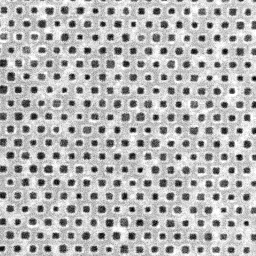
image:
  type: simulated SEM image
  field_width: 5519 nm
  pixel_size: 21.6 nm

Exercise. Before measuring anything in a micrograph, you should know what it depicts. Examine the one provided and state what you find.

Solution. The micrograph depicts a regular array of holes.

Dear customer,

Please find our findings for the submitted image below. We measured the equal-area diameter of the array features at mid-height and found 188 nm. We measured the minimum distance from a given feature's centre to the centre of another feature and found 322 nm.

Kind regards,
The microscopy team